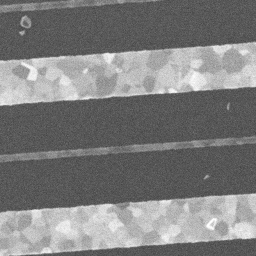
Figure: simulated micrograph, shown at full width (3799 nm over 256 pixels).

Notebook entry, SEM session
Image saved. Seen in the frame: lines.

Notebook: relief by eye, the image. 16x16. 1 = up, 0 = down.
0000000000000000
0000000000000000
0000000000000000
0000111111111111
1111111111111111
1111111111111100
1000000000000000
0000000000000000
0000000000000000
0000000000000000
0000000000000000
0000000000000000
0000000000011111
1111111111111111
1111111111111111
1111111000000000